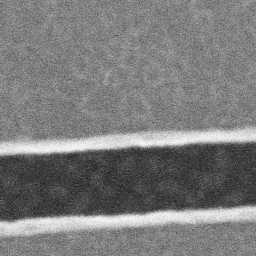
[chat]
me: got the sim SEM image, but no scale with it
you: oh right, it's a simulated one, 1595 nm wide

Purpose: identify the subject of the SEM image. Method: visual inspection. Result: one or a few lines or trenches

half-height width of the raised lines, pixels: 79.6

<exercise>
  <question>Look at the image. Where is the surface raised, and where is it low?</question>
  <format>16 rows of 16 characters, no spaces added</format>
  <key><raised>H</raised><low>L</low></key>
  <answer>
LLLLLLLLLLLLLLLL
LLLLLLLLLLLLLLLL
LLLLLLLLLLLLLLLL
LLLLLLLLLLLLLLLL
LLLLLLLLLLLLLLLL
LLLLLLLLLLLLLLLL
LLLLLLLLLLLLLLLL
LLLLLLLLLLLLLLLL
LLLLLLLLLLLLLLHH
HHHHHHHHHHHHHHHH
HHHHHHHHHHHHHHHH
HHHHHHHHHHHHHHHH
HHHHHHHHHHHHHHHH
HHHHHHHHHHHHHLLL
LLLLLLLLLLLLLLLL
LLLLLLLLLLLLLLLL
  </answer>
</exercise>